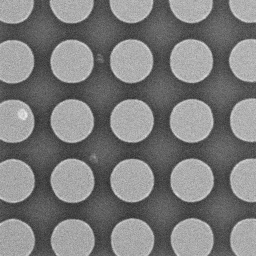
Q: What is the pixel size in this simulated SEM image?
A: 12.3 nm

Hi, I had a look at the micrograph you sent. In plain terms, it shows an array of small figures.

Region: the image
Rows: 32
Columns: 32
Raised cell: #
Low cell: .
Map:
####..######..#####..######..###
####...####...#####...####...###
###.....##.....###.....##.....##
................................
................................
###.....##.....###....####....##
####...####...#####...####...###
####..######..#####..######..###
####...####...#####..#####...###
###....####....###....####....##
................................
................................
...............................#
####...####...#####...####...###
####..######..#####..######..###
####..######..#####..######..###
####...####...#####...####...###
###.....##.....###.....##.....##
................................
................................
###....####....###....####....##
####...####...#####...####...###
####..######..#####..######..###
####...#####..#####...####...###
###....####....###....####....##
................................
................................
.#..............#......##......#
####...####...#####...####...###
####...#####..#####..######..###
####...#####..#####..######..###
####...####...#####...####...###